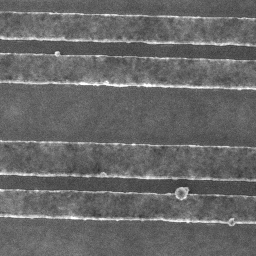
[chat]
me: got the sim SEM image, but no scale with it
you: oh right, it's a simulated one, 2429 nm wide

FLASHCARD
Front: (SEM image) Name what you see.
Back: lines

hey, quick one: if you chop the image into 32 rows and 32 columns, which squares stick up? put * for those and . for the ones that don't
................................
................................
********************************
********************************
********************************
........................********
................................
***************************.....
********************************
********************************
..........**********************
................................
................................
................................
................................
................................
................................
................................
********************************
********************************
********************************
********************************
...........................*****
......................*.........
****************************....
********************************
********************************
....................************
................................
................................
................................
................................